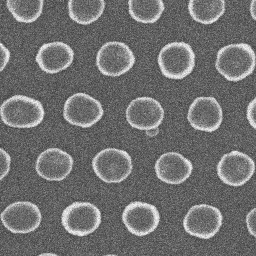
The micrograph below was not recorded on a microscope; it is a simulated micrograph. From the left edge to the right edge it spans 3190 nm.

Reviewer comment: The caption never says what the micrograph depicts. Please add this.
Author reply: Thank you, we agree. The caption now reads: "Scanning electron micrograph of a regular array of raised bodies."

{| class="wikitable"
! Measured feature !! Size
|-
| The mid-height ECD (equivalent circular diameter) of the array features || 34.6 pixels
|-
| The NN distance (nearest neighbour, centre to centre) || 743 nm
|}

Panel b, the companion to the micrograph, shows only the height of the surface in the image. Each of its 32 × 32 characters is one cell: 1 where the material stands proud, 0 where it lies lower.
01111000011110001111000011110001
01111000011110001111000011110001
00010000011100000110000001100000
00000000000000000000000000000000
00000000000000000000000000000000
00000011000001100000011000000000
10000111100011110000111100011110
10000111100011111000111100011111
00000111000011110000111100011111
00000000000000100000011000001100
00000000000000000000000000000000
00000000000000000000000000000000
01110000111100000110000011100000
11111000111110001111000011110001
11111000111110001111000011110001
01111000011000001111000011100000
00000000000000000000000000000000
00000000000000000000000000000000
00000000000000000000000000000000
10000111100011110000111000001110
10000111100011110000111100011111
10000111100011110000111100011111
00000011000001100000111000001110
00000000000000000000000000000000
00000000000000000000000000000000
00110000001000000100000000000000
11111000111100001111000011100001
11111000111100011111000111110001
01110000111100001110000111100001
00000000000000000000000001000000
00000000000000000000000000000000
00000000000000000000000000000000